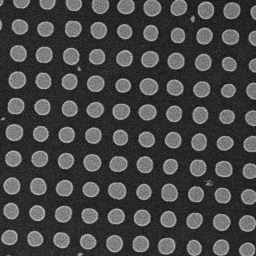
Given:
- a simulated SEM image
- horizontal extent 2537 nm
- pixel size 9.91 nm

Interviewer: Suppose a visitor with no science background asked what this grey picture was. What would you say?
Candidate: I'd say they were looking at an array of small figures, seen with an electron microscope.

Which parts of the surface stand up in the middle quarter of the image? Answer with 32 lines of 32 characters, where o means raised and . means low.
..............oo....ooo...oooo..
................................
.o..............................
ooo...ooo.......................
ooo...oooo...ooo...oooo...ooo...
ooo...oooo...oooo..oooo...oooo..
.......oo....ooo...oooo...oooo..
....................oo.....oo...
................................
oo..............................
ooo...oooo...ooo....oo..........
ooo...oooo..oooo...oooo...ooo...
ooo...ooo...oooo...oooo...ooo...
.............oo....ooo....ooo...
................................
................................
oo....ooo.....o.................
ooo...ooo....ooo...ooo....ooo...
oo...oooo...oooo...ooo...oooo...
o.....ooo....ooo...oooo..oooo...
....................oo....ooo...
................................
o...............................
oo...oooo...ooo....oo...........
oo...oooo...oooo..oooo...ooo....
oo...oooo..ooooo..oooo...ooo....
......oo....ooo....ooo...ooo....
................................
................................
o...............................
oo...ooo...oooo....oo....oo.....
oo...oooo..oooo...oooo...ooo....